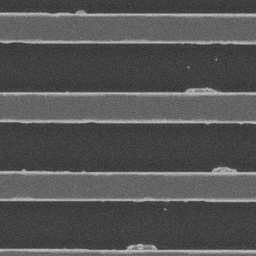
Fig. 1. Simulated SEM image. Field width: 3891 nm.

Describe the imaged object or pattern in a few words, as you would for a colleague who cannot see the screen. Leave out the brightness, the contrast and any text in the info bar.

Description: lines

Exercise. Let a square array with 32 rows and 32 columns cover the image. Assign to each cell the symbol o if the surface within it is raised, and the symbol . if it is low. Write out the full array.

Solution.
................................
................................
oooooooooooooooooooooooooooooooo
oooooooooooooooooooooooooooooooo
oooooooooooooooooooooooooooooooo
................................
................................
................................
................................
................................
................................
................................
oooooooooooooooooooooooooooooooo
oooooooooooooooooooooooooooooooo
oooooooooooooooooooooooooooooooo
................................
................................
................................
................................
................................
................................
ooooooo.........................
oooooooooooooooooooooooooooooooo
oooooooooooooooooooooooooooooooo
oooooooooooooooooooooooooooooooo
................................
................................
................................
................................
................................
................................
oooooooooooooooooooooooooooooooo